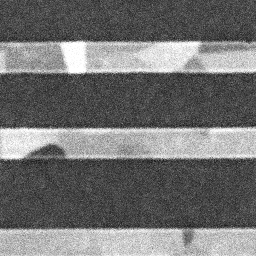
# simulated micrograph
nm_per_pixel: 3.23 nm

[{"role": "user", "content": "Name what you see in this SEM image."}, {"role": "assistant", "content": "one or a few lines or trenches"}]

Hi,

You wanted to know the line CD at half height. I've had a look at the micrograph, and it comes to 91.1 nanometres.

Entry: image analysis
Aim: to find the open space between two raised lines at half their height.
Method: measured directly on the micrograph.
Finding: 211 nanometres